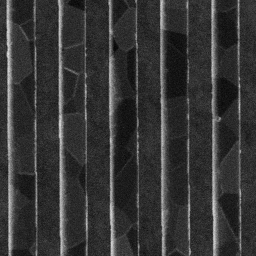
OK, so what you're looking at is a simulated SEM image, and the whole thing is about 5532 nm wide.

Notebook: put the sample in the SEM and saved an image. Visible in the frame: lines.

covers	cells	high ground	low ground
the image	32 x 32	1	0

01110000111000111000111000011100
01110000111000111000111000011100
01110001111000111000111000011100
01110001111000111000111000011100
01110001111000111000111000011100
01110001111000111000111000011100
01110000111000111000111000011100
01110000111000111000111100011100
01110000111000111000111100011100
01110000111000111000111100011100
01110000111000111000111100011100
01110000111000111000111000011100
01110000111000111000111100011100
01110000111000111000111100011100
01110000111000111000111100011100
01110000111000111000111100011100
01110000111000111000111100011100
01110000111000111000111100011100
01110000111000111000111100011100
01110000111000111000111100011100
01110000111000111000111100011100
01111000111000111000111100011100
01111000111000111000111100011100
01111000111000111000111100011100
01111000111000111000111100011100
01111000111000111000111100011100
01111000111000111000111100011100
01111000111000111000111100011100
01111000111000111000111100011100
01111000111000111000111100011100
01111000111000111000111100011100
01111000111000111000111100011100